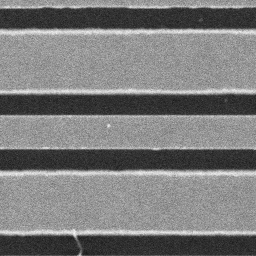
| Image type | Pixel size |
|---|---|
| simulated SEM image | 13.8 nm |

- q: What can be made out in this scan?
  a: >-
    lines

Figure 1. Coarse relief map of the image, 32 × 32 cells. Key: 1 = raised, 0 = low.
11111111111111111111111111111111
00000000000000000000000000000000
00000000000000000000000000000000
00000000000000000000000000000000
11111111111111111111111111111111
11111111111111111111111111111111
11111111111111111111111111111111
11111111111111111111111111111111
11111111111111111111111111111111
11111111111111111111111111111111
11111111111111111111111111111111
11111111111111111111111111111111
00000000000000000000000000000000
00000000000000000000000000000000
00000000000000000000000000000000
11111111111111111111111111111111
11111111111111111111111111111111
11111111111111111111111111111111
11111111111111111111111111111111
00000000000000000000000000000000
00000000000000000000000000000000
11111111111111111111111111111111
11111111111111111111111111111111
11111111111111111111111111111111
11111111111111111111111111111111
11111111111111111111111111111111
11111111111111111111111111111111
11111111111111111111111111111111
11111111111111111111111111111111
00000000010000000000000000000000
00000000000000000000000000000000
00000000000000000000000000000000